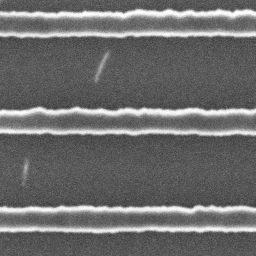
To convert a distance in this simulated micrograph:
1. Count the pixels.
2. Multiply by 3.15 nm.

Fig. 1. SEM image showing lines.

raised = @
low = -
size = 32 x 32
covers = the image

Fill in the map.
--------------------------------
----------------@@@@@@-@--@@-@@@
@@@@@@@@@@@@@@@@@@@@@@@@@@@@@@@@
@@@@@@@@@@@@@@@@@@@@@@@@@@@@@@@@
--@-@@---------@----------------
--------------------------------
--------------------------------
--------------------------------
--------------------------------
--------------------------------
--------------------------------
--------------------------------
--------------------------------
--------------------------------
@@@@@@@@@@@@@@@@@@@@@@@@@@@@@@@@
@@@@@@@@@@@@@@@@@@@@@@@@@@@@@@@@
-@@@@@@@@@@@@@@@@@@-@@@@@@@@@@@@
--------------------------------
--------------------------------
--------------------------------
--------------------------------
--------------------------------
--------------------------------
--------------------------------
--------------------------------
--------------------------------
@@@@@@@@@@@@@@@@@@@@@@@@@@@@@@@@
@@@@@@@@@@@@@@@@@@@@@@@@@@@@@@@@
@@@@@@@@@@@@@@@@@@@@@@@@@@@@@@@@
--------------------------------
--------------------------------
--------------------------------